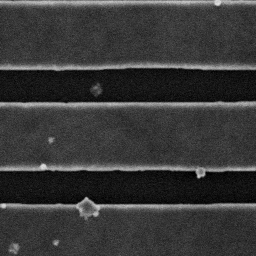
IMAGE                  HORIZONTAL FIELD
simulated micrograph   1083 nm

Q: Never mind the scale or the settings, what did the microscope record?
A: lines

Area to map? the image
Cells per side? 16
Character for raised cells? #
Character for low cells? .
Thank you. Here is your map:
################
################
################
################
................
................
################
################
################
################
################
................
................
################
################
################